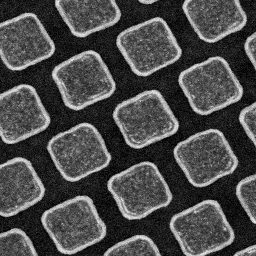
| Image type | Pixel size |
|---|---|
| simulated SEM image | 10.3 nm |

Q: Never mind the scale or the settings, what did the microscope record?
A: a regular array of raised bodies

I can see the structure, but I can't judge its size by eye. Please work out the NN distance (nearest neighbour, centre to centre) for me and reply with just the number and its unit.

746 nanometers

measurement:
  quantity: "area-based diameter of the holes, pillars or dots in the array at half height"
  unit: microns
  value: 0.56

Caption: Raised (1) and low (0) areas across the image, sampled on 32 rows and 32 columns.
00000001111111000000000111111100
00000000111111100000000111111100
00111000111111000001000011111110
11111000011110000111100011111100
11111100000000011111100001110000
11111110000000011111110000000001
11111100000000011111110000000001
01111000011110001111110000110000
01100001111110000111000011111000
00000001111111000000000111111000
00000001111111000000000111111100
01110000111111000000000111111100
11111000111100000111000011111100
11111000010000011111100011100001
11111100000000111111110000000011
11111100000000011111110000000001
11111000111100011111110000100001
01000001111110001110000111110000
00000011111110000000001111111000
00000001111111000000001111111000
01100001111110000010001111111000
11110000111100001111000111111000
11111000000000111111000011100001
11111000000000111111100000000011
11111000000000111111100000000011
11110000111000011111100001100011
11000011111100011110000111110001
00000111111100000000001111110000
00000011111110000000001111111000
11100001111110000000001111111000
11110001111000011110000111110000
11110000100000111111000111000011